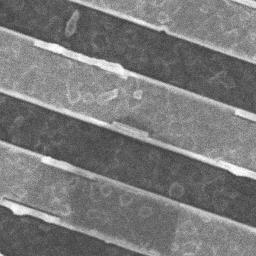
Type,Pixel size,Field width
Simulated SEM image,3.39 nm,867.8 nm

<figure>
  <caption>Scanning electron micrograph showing one or a few lines or trenches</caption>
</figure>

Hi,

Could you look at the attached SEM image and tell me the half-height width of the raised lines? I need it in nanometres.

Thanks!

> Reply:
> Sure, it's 203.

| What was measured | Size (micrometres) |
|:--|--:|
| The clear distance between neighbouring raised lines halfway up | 0.163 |